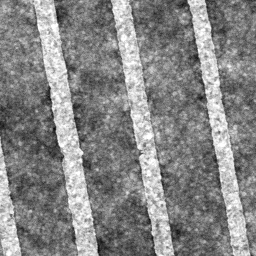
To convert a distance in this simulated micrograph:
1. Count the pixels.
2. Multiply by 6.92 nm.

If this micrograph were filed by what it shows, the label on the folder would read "one or a few lines or trenches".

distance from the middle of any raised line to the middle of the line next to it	522	nm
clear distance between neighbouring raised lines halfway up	401	nanometres